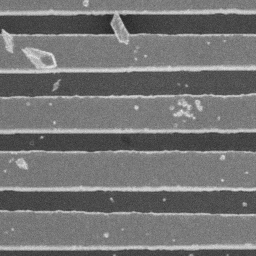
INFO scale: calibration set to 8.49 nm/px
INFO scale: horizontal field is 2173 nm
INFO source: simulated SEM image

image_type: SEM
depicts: lines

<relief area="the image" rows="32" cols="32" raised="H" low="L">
HHHHHHHHHHHHHHHHHHHHHHHHHHHHHHHH
HHHHHHHHHHHHHHHHHHHHHHHHHHHHHHHH
LLLLLLLLLLLLLLHLLLLLLLLLLLLLLLLL
LLLLLLLLLLLLLLHHLLLLLLLLLLLLLLLL
HHHHHHHHHHHHHHHHHHHHHHHHHHHHHHHH
HHHHHHHHHHHHHHHHHHHHHHHHHHHHHHHH
HHHHHHHHHHHHHHHHHHHHHHHHHHHHHHHH
HHHHHHHHHHHHHHHHHHHHHHHHHHHHHHHH
HHHHHHHHHHHHHHHHHHHHHHHHHHHHHHHH
LLLLLLLLLLLLLLLLLLLLLLLLLLLLLLLL
LLLLLLLLLLLLLLLLLLLLLLLLLLLLLLLL
LLLLLLLLLLLLLLLLLLLLLLLLLLLLLLLL
HHHHHHHHHHHHHHHHHHHHHHHHHHHHHHHH
HHHHHHHHHHHHHHHHHHHHHHHHHHHHHHHH
HHHHHHHHHHHHHHHHHHHHHHHHHHHHHHHH
HHHHHHHHHHHHHHHHHHHHHHHHHHHHHHHH
HHHHHHHHHHHHHHHHLLLLLLLLLLLLLLLL
LLLLLLLLLLLLLLLLLLLLLLLLLLLLLLLL
LLLLLLLLLLLLLLLLLLLLLLLLLLLLLLLL
HHHHHHHHHHHHHHHHHHHHHHHHHHHHHHHH
HHHHHHHHHHHHHHHHHHHHHHHHHHHHHHHH
HHHHHHHHHHHHHHHHHHHHHHHHHHHHHHHH
HHHHHHHHHHHHHHHHHHHHHHHHHHHHHHHH
HHHHHHHHHHHHHHHHHHHHHHHHHHHHHHHH
LLLLLLLLLLLLLLLLLLLLLLLLLLLLLLLL
LLLLLLLLLLLLLLLLLLLLLLLLLLLLLLLL
HHHHHHHHHHHLLLLLLLLLLLLLLLLLLLLL
HHHHHHHHHHHHHHHHHHHHHHHHHHHHHHHH
HHHHHHHHHHHHHHHHHHHHHHHHHHHHHHHH
HHHHHHHHHHHHHHHHHHHHHHHHHHHHHHHH
HHHHHHHHHHHHHHHHHHHHHHHHHHHHHHHH
LLLLLLLLLLLLLLLLLLLLLLLLLLLLLLLL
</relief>